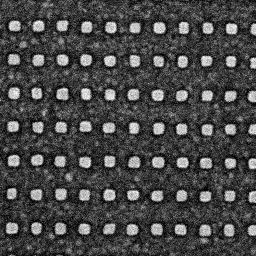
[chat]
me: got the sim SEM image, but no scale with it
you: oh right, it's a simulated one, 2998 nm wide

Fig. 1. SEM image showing a regular array of raised bodies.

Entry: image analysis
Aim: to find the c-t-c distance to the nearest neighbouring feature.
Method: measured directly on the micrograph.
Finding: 279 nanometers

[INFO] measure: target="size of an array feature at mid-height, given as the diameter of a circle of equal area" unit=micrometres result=0.126